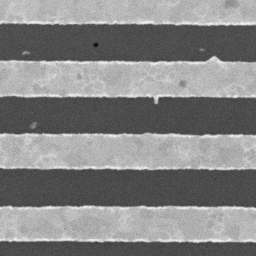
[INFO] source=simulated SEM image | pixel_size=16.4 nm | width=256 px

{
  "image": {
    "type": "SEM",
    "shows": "one or a few lines or trenches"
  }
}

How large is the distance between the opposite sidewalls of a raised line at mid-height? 564 nm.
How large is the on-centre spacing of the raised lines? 1.18 um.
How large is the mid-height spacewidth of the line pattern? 621 nm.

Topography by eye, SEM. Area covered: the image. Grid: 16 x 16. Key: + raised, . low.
++++++++++++++++
...........++.++
................
................
++++++++++++++++
++++++++++++++++
................
................
+++++++++++++++.
++++++++++++++++
+++.++++++++++++
................
................
++++++++++++++++
++++++++++++++++
................